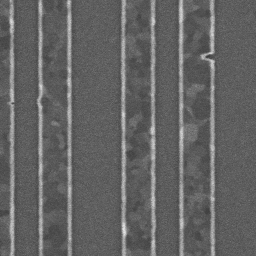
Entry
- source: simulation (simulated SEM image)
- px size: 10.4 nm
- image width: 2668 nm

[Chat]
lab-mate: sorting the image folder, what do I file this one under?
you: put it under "one or a few lines or trenches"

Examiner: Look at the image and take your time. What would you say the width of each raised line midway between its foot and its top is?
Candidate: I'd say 307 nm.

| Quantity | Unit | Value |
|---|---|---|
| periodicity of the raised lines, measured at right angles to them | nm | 738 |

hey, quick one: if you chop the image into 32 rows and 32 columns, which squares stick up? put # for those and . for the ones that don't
#....####......####....###......
##...####......####....###......
##...####......####....####.....
##...####......####....####.....
##...####......####....###......
##...####......####....####.....
#....####......####....###......
##...####......####....###......
##...####......####....####.....
#....####......####....####.....
#....####......####....####.....
#....####......####....####.....
#....####......####....####.....
##...####......####....####.....
#....####......####....####.....
##...####......####....####.....
#....####......####....####.....
#....####......####....####.....
#....####......####....####.....
##...####......####....####.....
##...####......####....####.....
##...####......####....####.....
##...####......####....####.....
##...####......####....####.....
#....####......####....####.....
##...####......####....####.....
#....####......####....####.....
#....####.......###....####.....
#....####.......###....####.....
##...####.......###....####.....
#....####.......###....####.....
##...####.......###....####.....